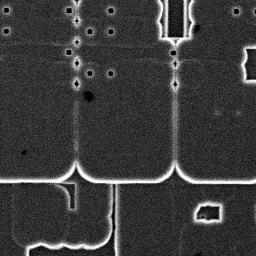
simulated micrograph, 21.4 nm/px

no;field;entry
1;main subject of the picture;wiring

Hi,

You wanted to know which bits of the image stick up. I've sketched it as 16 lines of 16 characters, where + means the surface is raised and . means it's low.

++++++++++..++++
++++++++++..++++
++++++++++++++++
+++++++++++++++.
+++++++++++++++.
++++++++++++++++
++++++++++++++++
++++++++++++++++
++++++++++++++++
++++++++++++++++
++++++++++++++++
................
................
................
................
................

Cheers